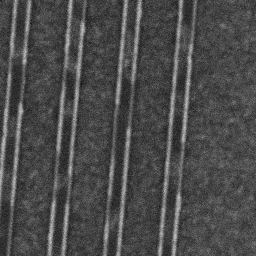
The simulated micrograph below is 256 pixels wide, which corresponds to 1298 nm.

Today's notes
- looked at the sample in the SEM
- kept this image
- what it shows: parallel lines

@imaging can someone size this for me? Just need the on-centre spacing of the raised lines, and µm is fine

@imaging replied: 0.279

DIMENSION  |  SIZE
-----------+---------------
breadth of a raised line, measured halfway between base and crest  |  82.8 nm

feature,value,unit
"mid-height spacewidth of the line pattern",38.6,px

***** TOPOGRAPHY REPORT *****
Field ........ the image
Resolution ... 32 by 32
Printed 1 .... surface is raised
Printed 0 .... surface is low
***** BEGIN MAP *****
00110000011000001100001100000000
00110000011000011100001100000000
00110000110000011100001100000000
01110000111000011000001100000000
01100000110000011000001100000000
01100000110000011000001100000000
01100000110000011000001100000000
01100000110000011000001100000000
01100000110000011000001100000000
01100000110000011000001100000000
01100000110000011000001100000000
01100000110000011000001100000000
01100000110000011000011100000000
01100000110000010000011000000000
01100001100000110000011000000000
11100001100000110000011000000000
11000001100000110000011000000000
11000001100000110000011000000000
11000001100000110000011000000000
11000001100000110000011000000000
11000001100000110000011000000000
11000001100000110000011000000000
11000001100000110000011000000000
11000001100000110000110000000000
11000001100000110000111000000000
11000001100000110000111000000000
11000011100001100000110000000000
10000011000001100000110000000000
10000011000001100000110000000000
10000011000001100000110000000000
10000011000001100000110000000000
10000011000001100000110000000000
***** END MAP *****